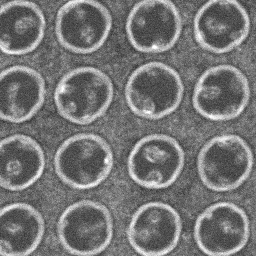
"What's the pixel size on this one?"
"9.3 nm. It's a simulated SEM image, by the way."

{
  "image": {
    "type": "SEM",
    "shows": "a regular array of raised bodies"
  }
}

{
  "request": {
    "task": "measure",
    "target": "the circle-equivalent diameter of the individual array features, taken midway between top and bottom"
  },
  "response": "473 nm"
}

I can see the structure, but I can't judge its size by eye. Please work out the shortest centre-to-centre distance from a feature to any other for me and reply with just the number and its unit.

626 nm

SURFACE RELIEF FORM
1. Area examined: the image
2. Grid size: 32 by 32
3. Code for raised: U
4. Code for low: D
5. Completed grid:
DUUUDDDDDUUUDDDDDDUUUDDDDDUUUUDD
UUUUUDDDUUUUUDDDDUUUUUDDDUUUUUDD
UUUUUDDUUUUUUUDDUUUUUUDDDUUUUUUD
UUUUUDDUUUUUUUDDUUUUUUDDDUUUUUUD
UUUUUDDUUUUUUDDDUUUUUUDDDUUUUUDD
UUUUDDDDUUUUDDDDDUUUUDDDDUUUUDDD
DUUDDDDDDDDDDDDDDDDDDDDDDDDDDDDD
DDDDDDDDDDDDDDDDDDDDDDDDDDDDDDDD
DDDDDDDDDDDDDDDDDDUUUDDDDDDDDDDD
UUUUUDDDDUUUUDDDDUUUUUDDDDUUUUDD
UUUUUDDDUUUUUUDDUUUUUUDDDUUUUUUD
UUUUUDDUUUUUUUDDUUUUUUDDDUUUUUUD
UUUUUDDUUUUUUUDDUUUUUUDDDUUUUUUD
UUUUDDDDUUUUUDDDDUUUUUDDDUUUUUDD
UUUUDDDDUUUUDDDDDDUUDDDDDDUUUDDD
DDDDDDDDDDDDDDDDDDDDDDDDDDDDDDDD
DDDDDDDDDDDDDDDDDDDDDDDDDDDDDDDD
DUUUDDDDDUUUDDDDDDUUUDDDDDDUUUDD
UUUUUDDDUUUUUDDDDUUUUUDDDDUUUUUD
UUUUUDDUUUUUUUDDUUUUUUUDDUUUUUUD
UUUUUDDUUUUUUUDDUUUUUUUDDUUUUUUD
UUUUUDDUUUUUUDDDUUUUUUDDDUUUUUUD
UUUUDDDDUUUUDDDDDUUDUDDDDDUUUUDD
DDDDDDDDDDDDDDDDDDDDDDDDDDDDDDDD
DDDDDDDDDDDDDDDDDDDDDDDDDDDDDDDD
DDDDDDDDDDUDDDDDDDDDDDDDDDDDDDDD
UUUUDDDDUUUUUDDDDUUUUUDDDDUUUUDD
UUUUUDDDUUUUUUDDDUUUUUDDDUUUUUUD
UUUUUDDDUUUUUUDDUUUUUUDDDUUUUUUD
UUUUUDDDUUUUUUDDUUUUUUDDDUUUUUUD
UUUUDDDDUUUUUDDDDUUUUUDDDUUUUUDD
UUUDDDDDDUUUDDDDDDUUUDDDDDUUUDDD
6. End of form